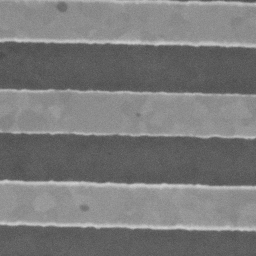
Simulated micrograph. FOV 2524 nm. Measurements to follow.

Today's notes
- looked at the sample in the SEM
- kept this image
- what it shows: lines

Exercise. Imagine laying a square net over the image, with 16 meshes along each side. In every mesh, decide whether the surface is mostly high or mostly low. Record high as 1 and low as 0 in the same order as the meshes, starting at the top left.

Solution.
1111111111111111
1111111111111111
1111111111111111
0000000000000000
0000000000000000
0000000000000000
1111111111111111
1111111111111111
0000000000001111
0000000000000000
0000000000000000
1111110000000000
1111111111111111
1111111111111111
0000000000000000
0000000000000000